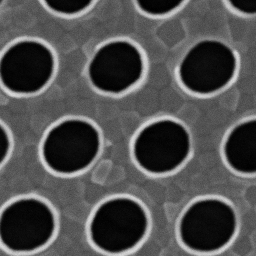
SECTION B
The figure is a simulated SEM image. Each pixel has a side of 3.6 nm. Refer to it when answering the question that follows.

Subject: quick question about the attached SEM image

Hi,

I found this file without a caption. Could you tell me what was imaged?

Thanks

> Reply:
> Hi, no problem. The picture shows holes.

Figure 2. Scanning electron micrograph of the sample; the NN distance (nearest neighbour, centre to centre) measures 325 nm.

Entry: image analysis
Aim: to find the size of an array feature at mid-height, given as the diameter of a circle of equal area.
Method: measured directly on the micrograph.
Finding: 190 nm